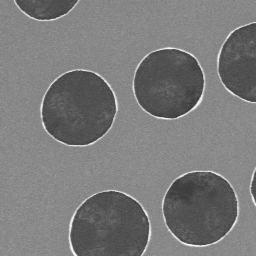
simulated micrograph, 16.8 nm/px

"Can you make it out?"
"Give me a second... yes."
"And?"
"holes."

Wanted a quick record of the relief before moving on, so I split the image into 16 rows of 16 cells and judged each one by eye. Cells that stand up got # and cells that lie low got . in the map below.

#...############
################
##############..
#########...##..
####..###....#..
###....#.....#..
###....##...####
###....#########
###...##########
################
################
###########...##
#####...##.....#
#####....#.....#
####.....##...##
#####....#######